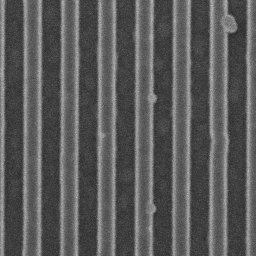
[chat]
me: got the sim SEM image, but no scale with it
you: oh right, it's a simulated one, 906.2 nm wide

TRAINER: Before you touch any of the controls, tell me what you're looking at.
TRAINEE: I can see parallel lines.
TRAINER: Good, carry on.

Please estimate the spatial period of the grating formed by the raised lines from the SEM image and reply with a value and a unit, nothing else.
37.3 pixels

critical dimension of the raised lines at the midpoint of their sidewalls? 15 px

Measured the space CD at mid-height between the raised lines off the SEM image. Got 22 px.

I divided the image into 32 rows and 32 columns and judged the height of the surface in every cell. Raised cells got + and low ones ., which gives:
...++...++..++...++...++..++...+
...++...++...+...++...++..++...+
...++...++...+...++...++..+++..+
...++...++...+...++...++..++++.+
...++...++...+...++...++..++...+
...++...++..++...++...++..++...+
...++...++..++...++...++..++...+
...++...++..++...++...++..++...+
...++...++..++...++...++..++...+
...++...++..++...++...++..++...+
...++...++..++...++...++..++...+
...++...++..++...++...++..++...+
...++...++..++...++...++..++...+
...++...++..++...++...++..++...+
...++...++..++...++...++..++...+
...++...++..++...++...++..++...+
...++...++..++...++...++..++...+
...++...++..++...++...++...+...+
...++...++..++...++...++...+...+
...++...++..++...++...++..++...+
...++...++..++...++...++..++...+
...++...++..++...++...++..++...+
...++...++..++...++...++..++...+
...++...++..++...++...++..++...+
...++...++..++...++...++..++...+
...++...++..++...++...++..++...+
...++...++..++...++...++..++...+
...++...++..++...++...++..++...+
...++...++..++...++...++..++...+
...++...++..++...++...++..++...+
...++...++..++...++...++..++...+
...++...++..++...++...++..++...+